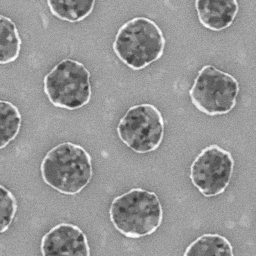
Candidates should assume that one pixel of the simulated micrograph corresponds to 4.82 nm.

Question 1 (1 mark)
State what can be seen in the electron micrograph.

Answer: raised bodies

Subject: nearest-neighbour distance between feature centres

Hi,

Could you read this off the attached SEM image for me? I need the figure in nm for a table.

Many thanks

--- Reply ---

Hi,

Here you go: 395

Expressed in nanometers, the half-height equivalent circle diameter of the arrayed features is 227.